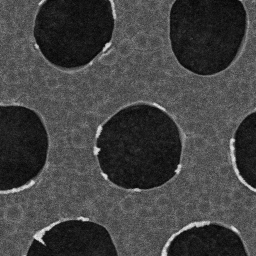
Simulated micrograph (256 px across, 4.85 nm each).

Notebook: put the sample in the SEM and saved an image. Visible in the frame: holes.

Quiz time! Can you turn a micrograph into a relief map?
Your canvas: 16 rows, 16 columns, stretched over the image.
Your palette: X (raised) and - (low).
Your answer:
XX-----XXXX----X
XX-----XXXX----X
XX-----XXXX----X
XXX---XXXXX----X
XXXXXXXXXXXX--XX
XXXXXXXXXXXXXXXX
XXXXXXXXXXXXXXXX
---XXXX----XXXX-
---XXX-----XXXX-
---XXX-----XXXX-
---XXX-----XXXX-
--XXXXX---XXXXXX
XXXXXXXXXXXXXXXX
XXXXXXXXXXXXXXXX
XXX----XXXX----X
XX-----XXXX----X